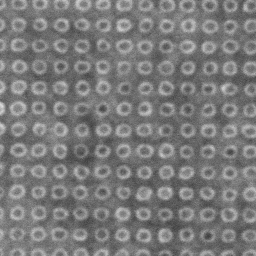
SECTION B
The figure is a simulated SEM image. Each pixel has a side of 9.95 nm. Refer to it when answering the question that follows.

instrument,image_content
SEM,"a regular array of raised bodies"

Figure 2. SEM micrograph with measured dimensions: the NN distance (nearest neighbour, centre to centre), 202 nanometres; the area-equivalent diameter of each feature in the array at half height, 0.118 microns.